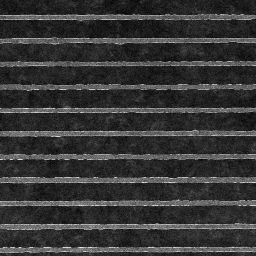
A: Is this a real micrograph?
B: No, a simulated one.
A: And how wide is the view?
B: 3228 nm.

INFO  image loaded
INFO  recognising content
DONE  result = parallel lines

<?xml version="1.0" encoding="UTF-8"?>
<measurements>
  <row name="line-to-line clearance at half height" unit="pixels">19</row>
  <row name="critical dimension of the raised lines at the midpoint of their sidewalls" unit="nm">55.1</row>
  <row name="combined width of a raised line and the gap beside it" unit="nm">293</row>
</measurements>